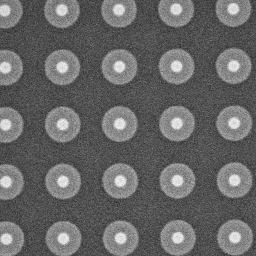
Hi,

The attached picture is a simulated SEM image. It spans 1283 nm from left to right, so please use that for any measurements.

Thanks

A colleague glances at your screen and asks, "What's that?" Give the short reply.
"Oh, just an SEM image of an array of small figures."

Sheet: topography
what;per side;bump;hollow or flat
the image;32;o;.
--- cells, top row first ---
ooo...oooo...oooo...oooo...oooo.
ooo...oooo...oooo...oooo...oooo.
oo....ooo....oooo...oooo...oooo.
................................
................................
................................
oo.....oo.....oo.....oo.....oo..
ooo...oooo...oooo...oooo...oooo.
ooo...oooo...oooo...oooo...oooo.
ooo...oooo...oooo...oooo...oooo.
o......o......o.................
................................
................................
o......oo.....oo.....oo.....oo..
ooo...oooo...oooo...oooo...oooo.
ooo...oooo...oooo...oooo...oooo.
ooo...oooo...oooo...oooo...oooo.
oo.....oo.....oo.....oo......o..
................................
................................
......................o......o..
oo....oooo...oooo...oooo...oooo.
ooo...oooo...oooo...oooo...oooo.
ooo...oooo...oooo...oooo...oooo.
oo.....oo.....oo.....oo.....oo..
................................
................................
................................
oo....oooo...oooo...oooo....ooo.
ooo...oooo...oooo...oooo...ooooo
ooo...oooo...oooo...oooo...oooo.
oo.....oo.....oo.....oo.....ooo.